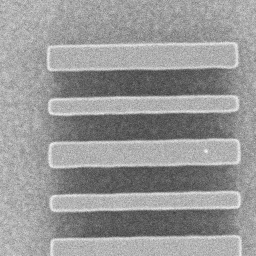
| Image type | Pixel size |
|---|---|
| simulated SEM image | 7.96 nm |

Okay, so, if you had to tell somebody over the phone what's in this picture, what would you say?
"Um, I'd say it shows groups of lines, slits or small figures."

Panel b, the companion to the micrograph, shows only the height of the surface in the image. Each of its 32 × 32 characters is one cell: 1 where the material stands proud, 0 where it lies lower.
00000000000000000000000000000000
00000000000000000000000000000000
00000000000000000000000000000000
00000000000000000000000000000000
00000000000000000000000000000000
00000000000000000000000001111000
00000011111111111111111111111100
00000011111111111111111111111100
00000011111111111111111110000000
00000000000000000000000000000000
00000000000000000000000000000000
00000000000000000000000000000000
00000011111111111111111111111100
00000011111111111111111111111100
00000000000000000000000000000000
00000000000000000000000000000000
00000000000000000000000000000000
00000000000000000000000001111000
00000011111111111111111111111100
00000011111111111111111111111100
00000011111111111111111111110000
00000000000000000000000000000000
00000000000000000000000000000000
00000000000000000000000000000000
00000001111111111111111111111100
00000011111111111111111111111100
00000000000000000000000000000000
00000000000000000000000000000000
00000000000000000000000000000000
00000000000000000000000000000000
00000011111111111111111111111100
00000011111111111111111111111100